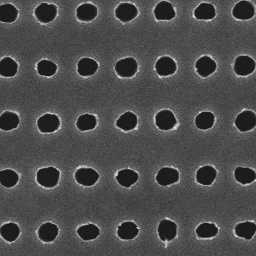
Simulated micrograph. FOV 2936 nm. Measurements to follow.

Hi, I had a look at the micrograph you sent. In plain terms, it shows a regular array of holes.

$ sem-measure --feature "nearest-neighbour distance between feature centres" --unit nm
447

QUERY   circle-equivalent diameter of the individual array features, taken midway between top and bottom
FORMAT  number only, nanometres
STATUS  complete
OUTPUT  222